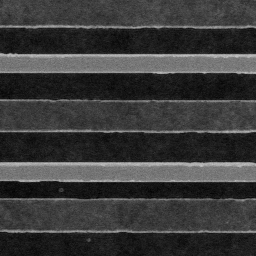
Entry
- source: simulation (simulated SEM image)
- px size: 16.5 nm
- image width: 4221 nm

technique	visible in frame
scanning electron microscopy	lines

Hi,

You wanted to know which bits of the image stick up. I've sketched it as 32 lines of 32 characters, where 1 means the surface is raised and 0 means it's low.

11111111111111111111111111111111
11111111111111111111111111111111
11111111111111111111111111111111
00000000000000000000000000000000
00000000000000000000000000000000
00000000000000000000000000000000
00000000000000000000000000000000
11111111111111111111111111111111
11111111111111111111111111111111
00000000000000000000000000000000
00000000000000000000000000000000
00000000000000000000000000000000
00000000000000000000000000000000
11111111111111111111111111111111
11111111111111111111111111111111
11111111111111111111111111111111
00000000000000000001000000111000
00000000000000000000000000000000
00000000000000000000000000000000
00000000000000000000000000000000
11111111111111111111111111111111
11111111111111111111111111111111
11111111111111111111111111111111
00000000000000000000000000000000
00000000000000000000000000000000
11111111111111111111111111111111
11111111111111111111111111111111
11111111111111111111111111111111
11111111111111111111111111111111
00000000000000000000000000000000
00000000000000000000000000000000
00000000000000000000000000000000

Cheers